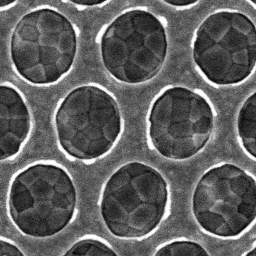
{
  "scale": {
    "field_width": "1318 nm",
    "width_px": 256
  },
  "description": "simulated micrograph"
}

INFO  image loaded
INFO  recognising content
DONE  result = holes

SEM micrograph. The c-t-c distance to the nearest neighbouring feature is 89.1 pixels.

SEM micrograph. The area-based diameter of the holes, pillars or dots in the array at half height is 362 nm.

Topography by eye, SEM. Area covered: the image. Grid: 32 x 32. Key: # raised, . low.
.#########...########...########
####...#########..#########..###
##.......#####......######.....#
##.......####.......#####.......
#.........###........####.......
#.........###........###........
#.........###........###........
##.......####........###........
##.......####.......#####.......
###.....######.....#######.....#
#####.#####################.####
..#######....########...########
...#####......######......#####.
...####........####.......####..
....###........####........###..
....###........####........###..
....###........####.......####..
...####.......#####.......####..
...#####......#####......######.
.########...########....########
################..##############
###.....######......######.....#
##.......#####.......####.......
#........####........###........
#.........###........###........
#........####........###........
#........####........###........
##.......####.......#####.......
##......######.....######......#
####..########....##########.###
..#######....########....#######
...#####......######......#####.